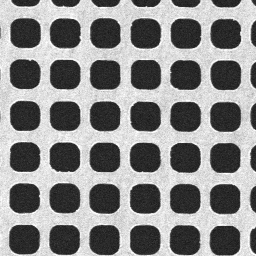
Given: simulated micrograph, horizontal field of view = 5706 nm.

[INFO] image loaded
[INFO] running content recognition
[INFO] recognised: a regular array of holes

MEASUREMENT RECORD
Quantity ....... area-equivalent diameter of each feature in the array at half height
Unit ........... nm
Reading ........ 724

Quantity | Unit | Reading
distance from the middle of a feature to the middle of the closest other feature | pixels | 40.1